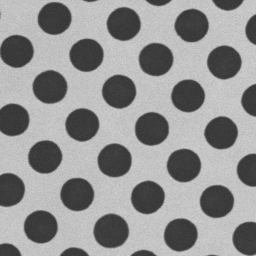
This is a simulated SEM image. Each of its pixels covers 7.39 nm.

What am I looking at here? a regular array of holes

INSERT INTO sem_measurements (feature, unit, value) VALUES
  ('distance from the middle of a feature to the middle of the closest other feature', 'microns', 0.36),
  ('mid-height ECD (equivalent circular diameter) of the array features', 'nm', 248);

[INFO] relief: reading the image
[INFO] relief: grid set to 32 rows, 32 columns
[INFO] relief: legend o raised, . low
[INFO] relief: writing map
oooooo..ooooooooooo..oooooo...oo
ooooo....ooooo...oooooo..ooooooo
ooooo....oooo....ooooo....ooooo.
ooooo...ooooo.....oooo....ooooo.
o..ooooooooooo...ooooo....ooooo.
....ooooo...ooooooo.oooooooooooo
....ooooo....ooooo...ooooo....oo
....ooooo....oooo.....oooo....oo
oooooooooo..oooooo...ooooo....oo
ooooo...oooooo..ooooooooooo..ooo
oooo....ooooo....ooooo...ooooooo
oooo....ooooo....oooo.....ooooo.
ooooo...ooooo....oooo....ooooo..
...ooooooooooo.ooooooo...ooooo..
....ooooo...oooooo..oooooooooooo
....oooo....ooooo....ooooo...ooo
...ooooo....ooooo....ooooo....oo
ooooooooo..oooooo....ooooo...ooo
oooo...oooooo...ooooooooooo.oooo
oooo....oooo....ooooo....oooooo.
oooo....oooo....ooooo....ooooo..
ooooo.ooooooo...ooooo....ooooo..
...oooooo..ooooooooooo..oooooo..
...ooooo....ooooo...oooooo..oooo
...ooooo....oooo.....oooo....ooo
..oooooo...oooooo...ooooo....ooo
oooo..ooooooooooo..oooooo....ooo
ooo....ooooo....oooooo.ooooooooo
ooo....ooooo....ooooo....ooooo..
ooo....ooooo....ooooo....oooo...
.ooooooooooo...oooooo...ooooo...
..oooooo...oooooo..ooooooooooo..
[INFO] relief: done